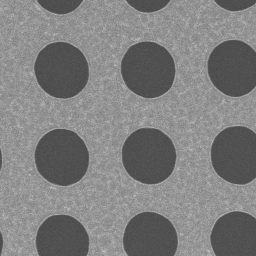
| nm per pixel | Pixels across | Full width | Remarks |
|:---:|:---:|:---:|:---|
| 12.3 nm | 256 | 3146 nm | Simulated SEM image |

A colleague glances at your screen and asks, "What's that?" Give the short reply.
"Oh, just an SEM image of holes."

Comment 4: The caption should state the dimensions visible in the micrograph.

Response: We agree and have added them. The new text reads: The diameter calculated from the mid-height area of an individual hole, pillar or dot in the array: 688 nm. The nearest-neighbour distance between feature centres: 1060 nanometers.